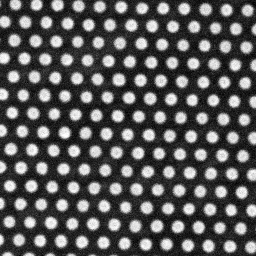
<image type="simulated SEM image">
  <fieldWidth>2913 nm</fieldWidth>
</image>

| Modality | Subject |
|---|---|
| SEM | a regular array of raised bodies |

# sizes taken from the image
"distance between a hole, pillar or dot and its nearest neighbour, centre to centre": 234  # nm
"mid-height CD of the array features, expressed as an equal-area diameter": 114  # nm